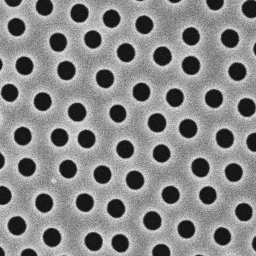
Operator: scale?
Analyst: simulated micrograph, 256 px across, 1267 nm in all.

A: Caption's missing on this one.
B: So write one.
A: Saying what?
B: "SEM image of a regular array of holes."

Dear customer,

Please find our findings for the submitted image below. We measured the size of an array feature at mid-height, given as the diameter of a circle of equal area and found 91.3 nm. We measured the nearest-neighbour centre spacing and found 157 nanometers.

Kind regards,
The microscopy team